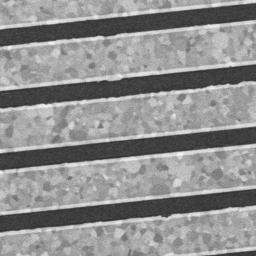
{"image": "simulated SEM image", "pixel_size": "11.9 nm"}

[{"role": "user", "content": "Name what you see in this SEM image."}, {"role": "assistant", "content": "one or a few lines or trenches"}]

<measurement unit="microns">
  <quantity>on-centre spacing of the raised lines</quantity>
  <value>0.735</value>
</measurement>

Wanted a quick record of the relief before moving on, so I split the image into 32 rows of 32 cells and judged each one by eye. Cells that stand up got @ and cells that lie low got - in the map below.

@@@@@@@@@@@@@@@@@@@@@@@@@@@-----
@@@@@@@@@@@@@@@@@@--------------
@@@@@@@@@-----------------------
-------------------------@@@@@@@
---------------@@@@@@@@@@@@@@@@@
------@@@@@@@@@@@@@@@@@@@@@@@@@@
@@@@@@@@@@@@@@@@@@@@@@@@@@@@@@@@
@@@@@@@@@@@@@@@@@@@@@@@@@@@@@@@@
@@@@@@@@@@@@@@@@@@@@@@@@@-------
@@@@@@@@@@@@@@@@----------------
@@@@@@-------------------------@
-----------------------@@@@@@@@@
--------------@@@@@@@@@@@@@@@@@@
----@@@@@@@@@@@@@@@@@@@@@@@@@@@@
@@@@@@@@@@@@@@@@@@@@@@@@@@@@@@@@
@@@@@@@@@@@@@@@@@@@@@@@@@@@@@@@@
@@@@@@@@@@@@@@@@@@@@@@@---------
@@@@@@@@@@@@@-------------------
@@@@-------------------------@@@
--------------------@@@@@@@@@@@@
----------@@@@@@@@@@@@@@@@@@@@@@
@@@@@@@@@@@@@@@@@@@@@@@@@@@@@@@@
@@@@@@@@@@@@@@@@@@@@@@@@@@@@@@@@
@@@@@@@@@@@@@@@@@@@@@@@@@@@@@@--
@@@@@@@@@@@@@@@@@@@@------------
@@@@@@@@@@@---------------------
@--------------------------@@@@@
------------------@@@@@@@@@@@@@@
--------@@@@@@@@@@@@@@@@@@@@@@@@
@@@@@@@@@@@@@@@@@@@@@@@@@@@@@@@@
@@@@@@@@@@@@@@@@@@@@@@@@@@@@@@@@
@@@@@@@@@@@@@@@@@@@@@@@@@@@-----